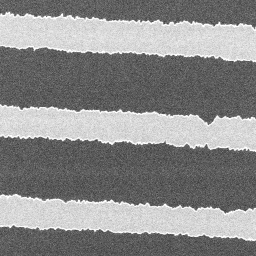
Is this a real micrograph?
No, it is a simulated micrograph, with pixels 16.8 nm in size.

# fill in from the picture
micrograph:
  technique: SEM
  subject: one or a few lines or trenches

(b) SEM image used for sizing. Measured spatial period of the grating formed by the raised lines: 1520 nanometres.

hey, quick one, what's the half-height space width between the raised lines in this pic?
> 1020 nm